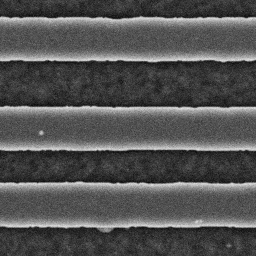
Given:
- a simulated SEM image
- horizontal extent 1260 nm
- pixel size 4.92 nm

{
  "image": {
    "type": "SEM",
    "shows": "lines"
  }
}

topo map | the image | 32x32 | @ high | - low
--------------------------------
--------------------------------
@@@@@@@@@@@@@@@@@@@@@@@@@@@@@@@@
@@@@@@@@@@@@@@@@@@@@@@@@@@@@@@@@
@@@@@@@@@@@@@@@@@@@@@@@@@@@@@@@@
@@@@@@@@@@@@@@@@@@@@@@@@@@@@@@@@
@@@@@@@@@@@@@@@@@@@@@@@@@@@@@@@@
@@-@@@@@@@@@@@@@@@@@@@@@@@@@@@@@
--------------------------------
--------------------------------
--------------------------------
--------------------------------
--------------------------------
@@@@@@@@@@@@@@@@@@@@@@@@@@@@@@@@
@@@@@@@@@@@@@@@@@@@@@@@@@@@@@@@@
@@@@@@@@@@@@@@@@@@@@@@@@@@@@@@@@
@@@@@@@@@@@@@@@@@@@@@@@@@@@@@@@@
@@@@@@@@@@@@@@@@@@@@@@@@@@@@@@@@
@@@@@@@@@@@@@@@@@@@@@@@@@@@@@@@@
--------------------------------
--------------------------------
--------------------------------
--------------------------------
@@@@@@@@@@@@@@@@@@@@@@@@@@@@@@@@
@@@@@@@@@@@@@@@@@@@@@@@@@@@@@@@@
@@@@@@@@@@@@@@@@@@@@@@@@@@@@@@@@
@@@@@@@@@@@@@@@@@@@@@@@@@@@@@@@@
@@@@@@@@@@@@@@@@@@@@@@@@@@@@@@@@
--------------------------------
--------------------------------
--------------------------------
--------------------------------